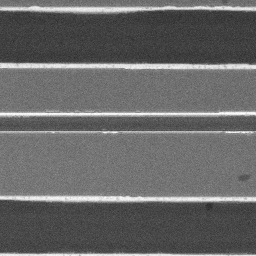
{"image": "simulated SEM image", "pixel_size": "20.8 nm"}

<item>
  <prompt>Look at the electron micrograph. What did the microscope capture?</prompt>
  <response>lines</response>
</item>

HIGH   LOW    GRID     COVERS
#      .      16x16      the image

................
................
................
................
################
################
################
################
################
################
################
################
................
................
................
................